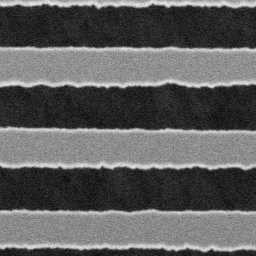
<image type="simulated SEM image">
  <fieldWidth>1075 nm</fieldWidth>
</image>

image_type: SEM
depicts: lines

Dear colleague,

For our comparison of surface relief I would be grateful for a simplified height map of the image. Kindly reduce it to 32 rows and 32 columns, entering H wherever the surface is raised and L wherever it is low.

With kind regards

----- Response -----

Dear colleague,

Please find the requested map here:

HHHHHLHHHHHHHHHHHHHLHHHHHHHHHHHH
LLLLLLLLLLLLLLLLLLLLLLLLLLLLLLLL
LLLLLLLLLLLLLLLLLLLLLLLLLLLLLLLL
LLLLLLLLLLLLLLLLLLLLLLLLLLLLLLLL
LLLLLLLLLLLLLLLLLLLLLLLLLLLLLLLL
LLLLLLLLLLLLLLLLLLLLLLLLLLLLLLLL
HHHHHHHHHHHHHHHHHHHHHHHHHHHHHHHH
HHHHHHHHHHHHHHHHHHHHHHHHHHHHHHHH
HHHHHHHHHHHHHHHHHHHHHHHHHHHHHHHH
HHHHHHHHHHHHHHHHHHHHHHHHHHHHHHHH
HHHHHHHHHHHHHHHHHHHHLLHHHHHHHHHL
LLLLLLLLLLLLLLLLLLLLLLLLLLLLLLLL
LLLLLLLLLLLLLLLLLLLLLLLLLLLLLLLL
LLLLLLLLLLLLLLLLLLLLLLLLLLLLLLLL
LLLLLLLLLLLLLLLLLLLLLLLLLLLLLLLL
LLLLLLLLLLLLLLLLLLLLLLLLLLLLLLLL
HHHHHHHHHHHHHHHHHHHHHHHHHHHHHHHH
HHHHHHHHHHHHHHHHHHHHHHHHHHHHHHHH
HHHHHHHHHHHHHHHHHHHHHHHHHHHHHHHH
HHHHHHHHHHHHHHHHHHHHHHHHHHHHHHHH
HHHHHHHHHHHHHHHHHHHHHHHHHHHHHHHH
LLLLLLLLLLLLLLLLLLLLLLLLLLLLLLLL
LLLLLLLLLLLLLLLLLLLLLLLLLLLLLLLL
LLLLLLLLLLLLLLLLLLLLLLLLLLLLLLLL
LLLLLLLLLLLLLLLLLLLLLLLLLLLLLLLL
LLLLLLLLLLLLLLLLLLLLLLLLLLLLLLLL
HHHHHHHHHHHHHHHHHHHHHHHHHHHHHHHH
HHHHHHHHHHHHHHHHHHHHHHHHHHHHHHHH
HHHHHHHHHHHHHHHHHHHHHHHHHHHHHHHH
HHHHHHHHHHHHHHHHHHHHHHHHHHHHHHHH
HHHHHHHHHHHHHHHHHHHHHHHHHHHHHHHH
LLLLLLLLLLLLLLLLLLLLLLLLLLLLLLLL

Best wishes